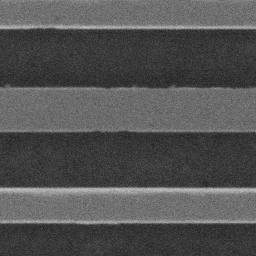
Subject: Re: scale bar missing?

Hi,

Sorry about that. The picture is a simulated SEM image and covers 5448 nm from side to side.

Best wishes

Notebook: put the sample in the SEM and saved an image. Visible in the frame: lines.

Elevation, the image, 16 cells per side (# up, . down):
################
################
................
................
................
................
################
################
................
................
................
................
################
################
................
................